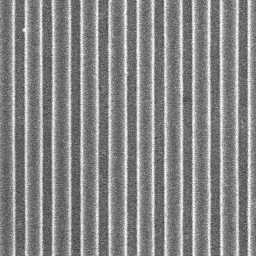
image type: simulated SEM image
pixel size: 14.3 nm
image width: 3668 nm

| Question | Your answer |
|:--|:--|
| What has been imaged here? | parallel lines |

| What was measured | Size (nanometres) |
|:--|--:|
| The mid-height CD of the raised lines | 235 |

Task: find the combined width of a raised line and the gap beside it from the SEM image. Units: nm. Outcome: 400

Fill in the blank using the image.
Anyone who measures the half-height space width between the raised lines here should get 165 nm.